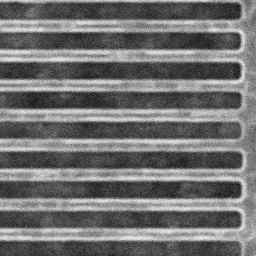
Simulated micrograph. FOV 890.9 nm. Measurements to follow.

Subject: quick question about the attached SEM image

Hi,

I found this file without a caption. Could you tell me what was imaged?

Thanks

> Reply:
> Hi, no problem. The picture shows parallel lines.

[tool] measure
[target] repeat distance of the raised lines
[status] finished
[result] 104 nm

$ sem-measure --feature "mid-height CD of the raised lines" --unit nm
36.5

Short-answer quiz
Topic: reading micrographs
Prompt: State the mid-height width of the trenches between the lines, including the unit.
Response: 19.2 px